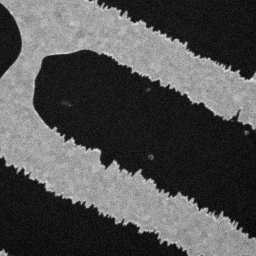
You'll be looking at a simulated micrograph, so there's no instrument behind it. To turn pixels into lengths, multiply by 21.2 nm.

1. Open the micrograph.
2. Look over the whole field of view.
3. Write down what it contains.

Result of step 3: one or a few lines or trenches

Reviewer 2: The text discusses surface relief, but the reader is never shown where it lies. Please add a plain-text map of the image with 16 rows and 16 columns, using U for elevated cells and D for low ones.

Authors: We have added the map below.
UUUUUUUDDDDDDDDD
DUUUUUUUUDDDDDDD
DUUUUUUUUUUDDDDD
DUUDDDDUUUUUDDDD
UUDDDDDDDUUUUUUD
UUDDDDDDDDDUUUUU
UUDDDDDDDDDDDUUU
UUUDDDDDDDDDDDDU
UUUUDDDDDDDDDDDD
UUUUUUDDDDDDDDDD
DUUUUUUDDDDDDDDD
DDDUUUUUUDDDDDDD
DDDDDUUUUUUUDDDD
DDDDDDDUUUUUUUDD
DDDDDDDDDDUUUUUD
DDDDDDDDDDDUUUUU